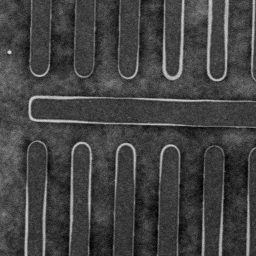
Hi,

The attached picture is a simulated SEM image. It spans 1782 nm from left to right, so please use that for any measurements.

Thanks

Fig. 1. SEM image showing groups of lines, slits or small figures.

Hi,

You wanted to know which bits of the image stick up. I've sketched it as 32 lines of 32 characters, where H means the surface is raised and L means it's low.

LLLLHHLLLHHHLLLHHLLLLHHLLLHHLLLL
LLLLHHLLLHHHLLLHHLLLLHHLLLHHLLLL
LLLLHHLLLHHHLLLHHLLLLHHLLLHHLLLL
LLLLHHLLLHHHLLLHHLLLLHHLLLHHLLLL
LLLLHHLLLHHHLLLHHLLLLHHLLLHHLLLL
LLLLHHLLLHHHLLLHHLLLLHHLLLHHLLLL
LLLLHHLLLHHHLLLHHLLLLHHLLLHHLLLL
LLLLHHLLLHHHLLLHHLLLLHHLLLHHLLLL
LLLLHHLLLHHHLLLHHLLLLHHLLLHHLLLH
LLLLLLLLLLHLLLLHHLLLLHLLLLHHLLLL
LLLLLLLLLLLLLLLLLLLLLLLLLLLLLLLL
LLLLLLLLLLLLLLLLLLLLLLLLLLLLLLLL
LLLLHHHHHHHHHHHHHHHHHLLLLLLLLLLL
LLLLHHHHHHHHHHHHHHHHHHHHHHHHHHHH
LLLLHHHHHHHHHHHHHHHHHHHHHHHHHHHH
LLLLLLLLLLLLLLLLLHHHHHHHHHHHHHHH
LLLLLLLLLLLLLLLLLLLLLLLLLLLLLLLL
LLLLLLLLLLLLLLLLLLLLLLLLLLLLLLLL
LLLLHHLLLHHLLLLHHLLLLHLLLLHLLLLL
LLLHHHLLLHHLLLLHHLLLHHLLLLHHLLLH
LLLHHHLLLHHLLLLHHLLLHHLLLLHHLLLH
LLLHHHLLLHHLLLLHHLLLHHLLLLHHLLLH
LLLHHHLLLHHLLLHHHLLLHHLLLLHHLLLH
LLLHHHLLLHHLLLHHHLLLHHLLLLHHLLLH
LLLHHHLLLHHLLLHHHLLLHHLLLHHHLLLH
LLLHHHLLLHHLLLHHHLLLHHLLLHHHLLLH
LLLHHHLLLHHLLLHHHLLLHHLLLHHHLLLH
LLLHHLLLLHHLLLHHHLLLHHLLLHHHLLLH
LLLHHLLLLHHLLLHHHLLLHHLLLHHHLLLH
LLLHHLLLLHHLLLHHHLLLHHLLLHHHLLLH
LLLHHLLLLHHLLLHHHLLLHHLLLHHHLLLH
LLLHHLLLLHHLLLHHHLLLHHLLLHHHLLLH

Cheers